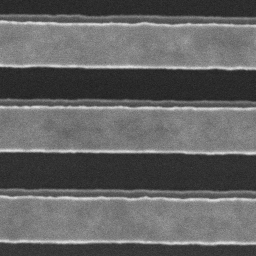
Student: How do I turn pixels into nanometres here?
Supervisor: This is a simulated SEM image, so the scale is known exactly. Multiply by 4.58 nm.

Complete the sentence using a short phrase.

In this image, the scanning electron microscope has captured lines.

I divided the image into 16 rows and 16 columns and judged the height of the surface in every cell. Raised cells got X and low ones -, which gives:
----------------
XXXXXXXXXXXXXXXX
XXXXXXXXXXXXXXXX
XXXXXXXXXXXXXXXX
----------------
----------------
XXXXXXXXXXXXXXXX
XXXXXXXXXXXXXXXX
XXXXXXXXXXXXXXXX
--XXXXXXXXXXXXXX
----------------
----------------
XXXXXXXXXXXXXXXX
XXXXXXXXXXXXXXXX
XXXXXXXXXXXXXXXX
----------------